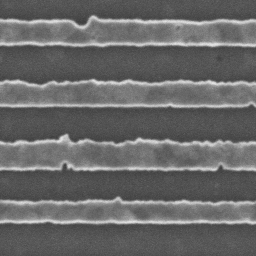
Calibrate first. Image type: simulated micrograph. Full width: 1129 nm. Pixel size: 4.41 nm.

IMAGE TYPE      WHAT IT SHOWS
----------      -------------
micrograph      one or a few lines or trenches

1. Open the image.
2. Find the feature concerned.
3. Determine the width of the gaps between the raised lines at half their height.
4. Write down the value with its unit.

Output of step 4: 0.162 micrometres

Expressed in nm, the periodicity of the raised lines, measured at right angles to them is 263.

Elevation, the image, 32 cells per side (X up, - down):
--------------------------------
--------------------------------
-----------X--------------------
XXXXXXXXXXXXXXXXXXXXXXXXXXXXXXXX
XXXXXXXXXXXXXXXXXXXXXXXXXXXXXXXX
XX---X--XXX-X---XX----XXXXXXXXXX
--------------------------------
--------------------------------
--------------------------------
--------------------------------
XXX---X-XXXXXXXXXXX-XXXXXXXXXXX-
XXXXXXXXXXXXXXXXXXXXXXXXXXXXXXXX
XXXXXXXXXXXXXXXXXXXXXXXXXXXXXXXX
--------------------------------
--------------------------------
--------------------------------
--------------------------------
-------XX-----------------------
XXXXXXXXXXXXXXXXXXXXXXXXXXXXXXXX
XXXXXXXXXXXXXXXXXXXXXXXXXXXXXXXX
XXXXXXXXXXXXXXXXXXXXXXXXXXXXXXXX
--------------------------------
--------------------------------
--------------------------------
--------------------------------
XXXXXXXXXXXXXXXXXXXXXXXXXXXXXXXX
XXXXXXXXXXXXXXXXXXXXXXXXXXXXXXXX
XXXXXXXXXXXXXXXXXXXXXXXXXXXXXXXX
--------------------------------
--------------------------------
--------------------------------
--------------------------------